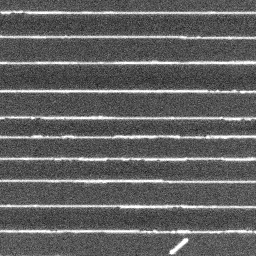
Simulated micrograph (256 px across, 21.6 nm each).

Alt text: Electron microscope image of lines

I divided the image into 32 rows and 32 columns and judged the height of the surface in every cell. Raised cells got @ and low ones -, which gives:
@@@@@@@@@@@@@@@@@@@@@@@@@@@@@@@@
@--@@@@@@@@@@@@@@@@@@@@@@@@@@@@@
--------------------------------
--------------------------------
--------------------------------
@@@@@@@@@@@@@@@@@@@@@@@@@@@@@@@@
@@@@@@@@@@@@@@@@@@@@@@@@@@@@@@@@
@@@@@@@@@@@@@@@@@@@@@@@@@@@@@@@@
--------------------------------
--------------------------------
--------------------------------
@@@@@@@@@@@@@@@@@@@@@@@@@-------
@@@@@@@@@@@@@@@@@@@@@@@@@@@@@@@@
@@@@@@@@@@@@@@@@@@@@@@@@@@@@@@@@
@@@@@@@@@@@@@@@@@@@@@@@@@@@@@@@@
--------------------------------
--------------------------------
@@@@@@@@@@@@@@@@@@@@@@@@@@@@@@@@
@@@@@@@@@@@@@@@@@@@@@@@@@@@@@@@@
@@@@@@@@@@@@@@@@@@@@@@@@@@@@@@@@
--------------------------------
--------------------------------
--------------------------------
@@@@@@@@@@@@@@@@@@@@@@@@@@@@@@@@
@@@@@@@@@@@@@@@@@@@@@@@@@@@@@@@@
@@@@@@@@@@@@@@@@@@@@@@@@@@@@@@@@
--------------------------------
--------------------------------
--------------------------------
@@@@@@@@@@@@@@@@@@@@@@@@@@@@@@@@
@@@@@@@@@@@@@@@@@@@@@@@@@@@@@@@@
@@@@@@@@@@@@@@@@@@@@@@@@@@@@@@@@